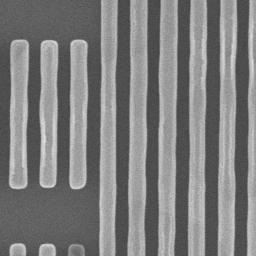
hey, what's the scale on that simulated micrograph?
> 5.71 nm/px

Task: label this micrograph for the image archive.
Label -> wiring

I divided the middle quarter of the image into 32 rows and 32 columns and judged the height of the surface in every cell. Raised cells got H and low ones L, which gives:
LLHHHHLLLLHHHLLLLHHHHLLLHHHHLLLL
LLHHHHLLLLHHHLLLLHHHHLLLHHHHLLLL
LLHHHHLLLLHHHLLLLHHHHLLLHHHHLLLL
LLHHHHLLLLHHHLLLLHHHHLLLHHHHLLLL
LLHHHHLLLHHHHLLLLHHHHLLLHHHHLLLL
LLHHHHLLLHHHHLLLLHHHHLLLHHHHLLLL
LLHHHHLLLHHHHLLLLHHHHLLLHHHHLLLL
LLHHHHLLLHHHHLLLLHHHHLLLHHHHLLLL
LLHHHHLLLHHHHLLLLHHHHLLLHHHHLLLL
LLHHHHLLLHHHHLLLLHHHHLLLHHHHLLLL
LLHHHHLLLHHHHLLLLHHHHLLLHHHHLLLL
LLHHHHLLLHHHHLLLLHHHHLLLHHHHLLLL
LLHHHHLLLHHHHLLLLHHHHLLLHHHHLLLL
LLHHHHLLLHHHHLLLLHHHHLLLHHHHLLLL
LLHHHHLLLHHHHLLLLHHHHLLLHHHHLLLL
LLHHHHLLLHHHHLLLLHHHHLLLHHHHLLLL
LLHHHHLLLHHHHLLLLHHHHLLLHHHHLLLL
LLHHHLLLLHHHHLLLLHHHHLLLHHHHLLLL
LLHHHLLLLHHHHLLLLHHHHLLLHHHHLLLL
LLHHHLLLLHHHHLLLLHHHHLLLHHHHLLLL
LHHHHLLLLHHHHLLLLHHHHLLLHHHHLLLL
LHHHHLLLLHHHHLLLHHHHHLLLHHHHLLLL
LHHHHLLLLHHHHLLLHHHHLLLLHHHHLLLL
LHHHHLLLLHHHHLLLHHHHLLLLHHHHLLLL
LHHHHLLLLHHHHLLLHHHHLLLLHHHHLLLL
LHHHHLLLLHHHHLLLHHHHLLLLHHHHLLLL
LHHHHLLLLHHHHLLLHHHHLLLLHHHHLLLL
LHHHHLLLLHHHHLLLHHHHLLLLHHHHLLLL
LHHHHLLLLHHHHLLLHHHHLLLLHHHHLLLL
LHHHHLLLLHHHHLLLHHHHLLLLHHHHLLLH
LLHHHLLLLHHHHLLLHHHHLLLLHHHHLLLH
LLLLLLLLLHHHHLLLHHHHLLLLHHHHLLLH